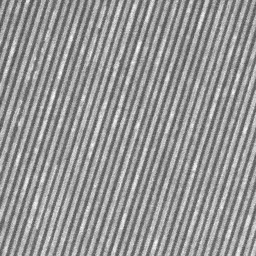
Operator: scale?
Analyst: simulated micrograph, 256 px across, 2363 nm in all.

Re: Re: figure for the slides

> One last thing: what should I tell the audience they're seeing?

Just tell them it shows parallel lines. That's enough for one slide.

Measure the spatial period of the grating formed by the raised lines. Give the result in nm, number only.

68.7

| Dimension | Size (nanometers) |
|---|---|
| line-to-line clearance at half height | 36.3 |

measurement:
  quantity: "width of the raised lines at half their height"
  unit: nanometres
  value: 28.7